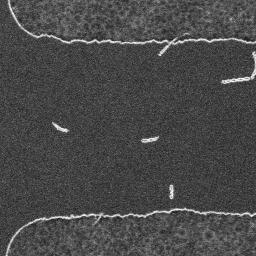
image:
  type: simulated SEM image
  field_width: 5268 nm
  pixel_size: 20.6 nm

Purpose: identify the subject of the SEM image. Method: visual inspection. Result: one or a few lines or trenches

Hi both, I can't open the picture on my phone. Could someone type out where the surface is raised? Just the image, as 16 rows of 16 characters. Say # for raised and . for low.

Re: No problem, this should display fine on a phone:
#...............
#...............
####..........#.
################
################
################
################
################
################
################
################
################
################
#####.##........
#...............
#...............